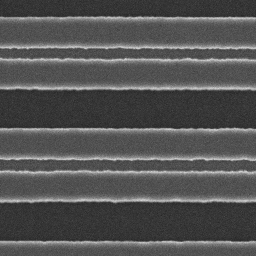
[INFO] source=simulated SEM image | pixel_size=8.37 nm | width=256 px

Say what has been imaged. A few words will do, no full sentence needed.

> lines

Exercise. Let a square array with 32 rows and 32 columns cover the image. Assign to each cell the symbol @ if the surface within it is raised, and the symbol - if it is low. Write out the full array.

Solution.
--------------------------------
--------------------------------
@@@@@@@@@@@@@@@@@@@@@@@@@@@@@@@@
@@@@@@@@@@@@@@@@@@@@@@@@@@@@@@@@
@@@@@@@@@@@@@@@@@@@@@@@@@@@@@@@@
@@@@@@@@@@@@@@@@@@@@@@@@@@@@@@@@
@@@@@@@@@@@@@@@@@@@@@@@@@@@@@@@@
@@@@@@@@@@@@@@@@@@@@@@@@@@@@@@@@
@@@@@@@@@@@@@@@@@@@@@@@@@@@@@@@@
@@@@@@@@@@@@@@@@@@@@@@@@@@@@@@@@
@@@@@@@@@@@@@@@@@@@@@@@@@@@@@@@@
--------------------------------
--------------------------------
--------------------------------
--------------------------------
--------------------------------
@@@@@@@@@@@@@@@@@@@@@@@@@@@@@@@@
@@@@@@@@@@@@@@@@@@@@@@@@@@@@@@@@
@@@@@@@@@@@@@@@@@@@@@@@@@@@@@@@@
@@@@@@@@@@@@@@@@@@@@@@@@@@@@@@@@
@@@@@@@@@@@@@@@@@@@@@@@@@@@@@@@@
@@@@@@@@@@@@@@@@@@@@@@@@@@@@@@@@
@@@@@@@@@@@@@@@@@@@@@@@@@@@@@@@@
@@@@@@@@@@@@@@@@@@@@@@@@@@@@@@@@
@@@@@@@@@@@@@@@@@@@@@@@@@@@@@@@@
--------------------------------
--------------------------------
--------------------------------
--------------------------------
--------------------------------
@@@@@@@@@@@@@@@@@@@@@@@@@@@@@@@@
@@@@@@@@@@@@@@@@@@@@@@@@@@@@@@@@